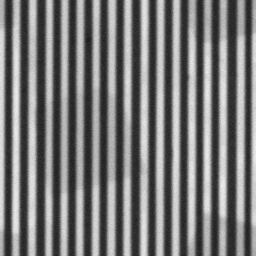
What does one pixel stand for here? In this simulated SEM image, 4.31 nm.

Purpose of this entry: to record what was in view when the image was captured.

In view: parallel lines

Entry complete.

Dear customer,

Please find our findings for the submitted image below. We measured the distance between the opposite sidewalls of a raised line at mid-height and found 23.7 nm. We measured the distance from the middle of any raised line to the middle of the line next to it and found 69.1 nm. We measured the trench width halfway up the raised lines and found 43.6 nm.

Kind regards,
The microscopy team